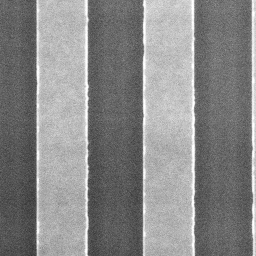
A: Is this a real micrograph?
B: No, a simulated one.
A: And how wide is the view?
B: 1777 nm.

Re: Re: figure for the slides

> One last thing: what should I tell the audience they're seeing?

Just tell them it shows lines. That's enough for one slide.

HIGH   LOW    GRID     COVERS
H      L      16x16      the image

LLHHHLLLLHHHLLLL
LLHHHLLLLHHHLLLL
LLHHHLLLLHHHLLLL
LLHHHLLLLHHHLLLL
LLHHHLLLLHHHLLLL
LLHHHLLLLHHHLLLL
LLHHHLLLLHHHLLLL
LLHHHLLLLHHHLLLL
LLHHHLLLLHHHLLLL
LLHHHLLLLHHHLLLL
LLHHHLLLLHHHLLLL
LLHHHLLLLHHHLLLL
LLHHHLLLLHHHLLLL
LLHHHLLLLHHHLLLL
LLHHHLLLLHHHLLLL
LLHHHLLLLHHHLLLL